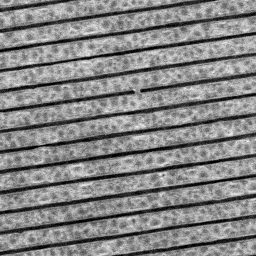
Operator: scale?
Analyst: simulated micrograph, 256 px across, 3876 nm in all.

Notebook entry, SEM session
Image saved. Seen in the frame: parallel lines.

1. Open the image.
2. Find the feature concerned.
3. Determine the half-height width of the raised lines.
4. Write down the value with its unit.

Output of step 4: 234 nanometers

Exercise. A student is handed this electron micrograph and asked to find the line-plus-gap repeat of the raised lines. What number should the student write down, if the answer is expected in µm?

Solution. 0.303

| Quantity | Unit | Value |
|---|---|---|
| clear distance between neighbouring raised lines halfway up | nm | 65.5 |